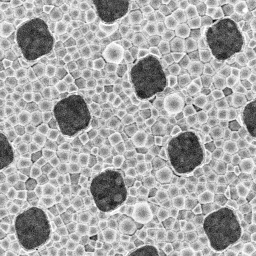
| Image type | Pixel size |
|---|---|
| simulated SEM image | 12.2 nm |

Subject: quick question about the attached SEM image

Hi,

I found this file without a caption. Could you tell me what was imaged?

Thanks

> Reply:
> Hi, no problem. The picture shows a regular array of raised bodies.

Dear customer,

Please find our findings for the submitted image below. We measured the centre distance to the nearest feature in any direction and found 731 nanometres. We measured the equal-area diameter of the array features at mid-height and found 0.486 micrometres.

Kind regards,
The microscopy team